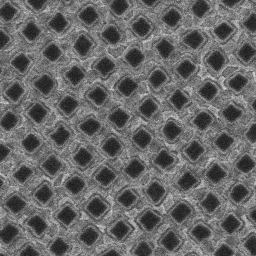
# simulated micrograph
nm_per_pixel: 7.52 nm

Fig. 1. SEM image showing a regular array of raised bodies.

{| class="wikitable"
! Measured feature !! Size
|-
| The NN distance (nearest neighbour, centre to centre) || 0.225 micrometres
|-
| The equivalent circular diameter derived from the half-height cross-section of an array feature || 153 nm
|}